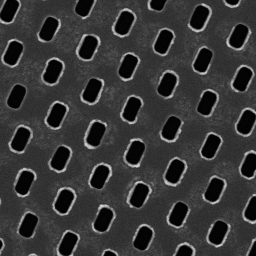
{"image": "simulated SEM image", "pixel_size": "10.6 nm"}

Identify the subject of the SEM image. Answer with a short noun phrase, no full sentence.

a regular array of holes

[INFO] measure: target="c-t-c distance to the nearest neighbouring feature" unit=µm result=0.457